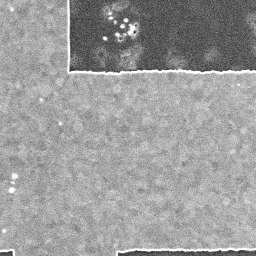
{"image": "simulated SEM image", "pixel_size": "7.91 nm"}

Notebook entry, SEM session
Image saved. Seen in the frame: one or a few lines or trenches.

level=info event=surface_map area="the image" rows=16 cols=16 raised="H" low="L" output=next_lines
HHHHLLLLLLLLLLLL
HHHHLLLLLLLLLLLL
HHHHLLLLLLLLLLLL
HHHHLLLLLLLLLLLL
HHHHHLLLHHHHLHHH
HHHHHHHHHHHHHHHH
HHHHHHHHHHHHHHHH
HHHHHHHHHHHHHHHH
HHHHHHHHHHHHHHHH
HHHHHHHHHHHHHHHH
HHHHHHHHHHHHHHHH
HHHHHHHHHHHHHHHH
HHHHHHHHHHHHHHHH
HHHHHHHHHHHHHHHH
HHHHHHHHHHHHHHHH
HHHHHHHHHHHHHHHH